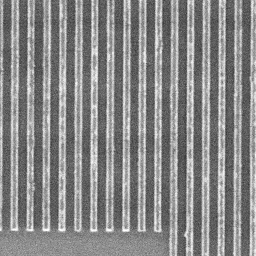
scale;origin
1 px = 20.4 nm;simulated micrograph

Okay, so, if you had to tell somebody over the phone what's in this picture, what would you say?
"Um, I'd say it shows parallel lines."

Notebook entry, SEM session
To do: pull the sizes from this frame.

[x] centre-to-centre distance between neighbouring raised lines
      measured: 326 nm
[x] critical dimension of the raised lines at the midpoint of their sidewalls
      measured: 112 nm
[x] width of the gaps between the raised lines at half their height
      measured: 10 px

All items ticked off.